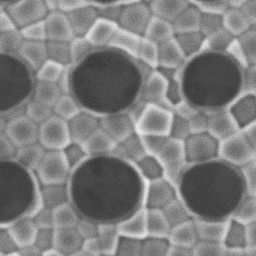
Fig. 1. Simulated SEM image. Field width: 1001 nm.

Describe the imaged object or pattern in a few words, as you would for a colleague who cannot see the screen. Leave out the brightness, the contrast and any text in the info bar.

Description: raised bodies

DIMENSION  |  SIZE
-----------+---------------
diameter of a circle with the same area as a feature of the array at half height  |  0.26 um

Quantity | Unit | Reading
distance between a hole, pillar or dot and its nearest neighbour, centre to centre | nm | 414